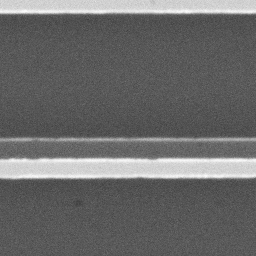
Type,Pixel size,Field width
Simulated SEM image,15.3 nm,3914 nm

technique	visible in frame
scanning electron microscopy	lines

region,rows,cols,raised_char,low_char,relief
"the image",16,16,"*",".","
****************
................
................
................
................
................
................
................
................
****************
****************
................
................
................
................
................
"